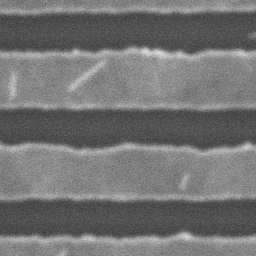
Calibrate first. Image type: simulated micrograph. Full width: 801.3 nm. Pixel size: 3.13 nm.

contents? lines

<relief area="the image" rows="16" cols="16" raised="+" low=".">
++++++++++++++++
................
................
++++++++++++++++
++++++++++++++++
++++++++++++++++
++++++++++++++++
................
................
++++++++++++++++
++++++++++++++++
++++++++++++++++
................
................
................
++++++++++++++++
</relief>